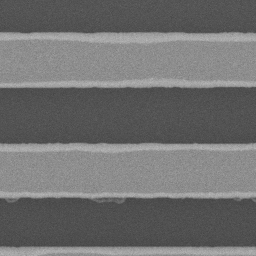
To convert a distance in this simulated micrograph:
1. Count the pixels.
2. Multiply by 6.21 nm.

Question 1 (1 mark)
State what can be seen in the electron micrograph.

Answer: lines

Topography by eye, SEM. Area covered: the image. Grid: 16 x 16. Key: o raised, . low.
................
................
oooooooooooooooo
oooooooooooooooo
oooooooooooooooo
................
................
................
................
oooooooooooooooo
oooooooooooooooo
oooooooooooooooo
................
................
................
................